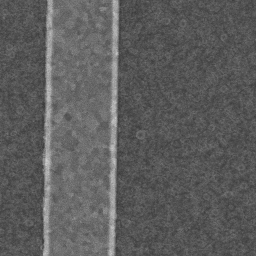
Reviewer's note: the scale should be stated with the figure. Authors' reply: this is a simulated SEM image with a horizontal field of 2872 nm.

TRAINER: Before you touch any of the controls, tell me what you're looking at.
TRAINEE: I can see one or a few lines or trenches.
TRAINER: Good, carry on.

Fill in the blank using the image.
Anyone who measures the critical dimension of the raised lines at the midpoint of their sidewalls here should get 743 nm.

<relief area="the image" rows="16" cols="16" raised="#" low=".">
...####.........
...####.........
...####.........
...####.........
...####.........
...####.........
...####.........
...####.........
...####.........
...####.........
...####.........
...####.........
...####.........
...####.........
...####.........
...####.........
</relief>